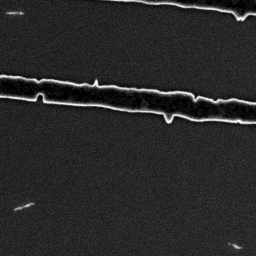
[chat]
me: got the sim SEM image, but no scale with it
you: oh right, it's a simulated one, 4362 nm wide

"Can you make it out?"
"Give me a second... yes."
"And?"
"one or a few lines or trenches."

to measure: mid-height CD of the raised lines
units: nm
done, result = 372